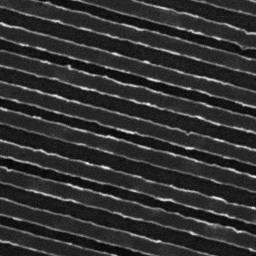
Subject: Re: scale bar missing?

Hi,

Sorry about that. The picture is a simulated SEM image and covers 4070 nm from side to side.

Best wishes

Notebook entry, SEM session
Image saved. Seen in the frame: parallel lines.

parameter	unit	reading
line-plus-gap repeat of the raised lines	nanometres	448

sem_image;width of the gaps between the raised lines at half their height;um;0.194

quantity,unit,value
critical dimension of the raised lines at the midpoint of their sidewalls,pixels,15.7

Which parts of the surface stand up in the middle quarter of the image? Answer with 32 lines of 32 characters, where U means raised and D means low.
UDDDDDDDDUUUUUUUUUUUUUUUDDDDDDDD
UUUDDDDDDDDDDUUUUUUUUUUUUUUUDDDD
UUUUUUDDDDDDDDDDDDUUUUUUUUUUUUUD
UUUUUUUUUUUDDDDDDDDDDUUUUUUUUUUU
UUUUUUUUUUUUUUDDDDDDDDDDUUUUUUUU
DDDUUUUUUUUUUUUUUUDDDDDDDDDDUUUU
DDDDDDUUUUUUUUUUUUUUUUDDDDDDDDDD
DDDDDDDDDDUUUUUUUUUUUUUUUDDDDDDD
DDDDDDDDDDDDDDUUUUUUUUUUUUUUUDDD
UUUDDDDDDDDDDDDDDDUUUUUUUUUUUUUU
UUUUUUUDDDDDDDDDDDDDDUUUUUUUUUUU
UUUUUUUUUUUDDDDDDDDDDDDDDDUUUUUU
UUUUUUUUUUUUUUDDDDDDDDDDDDDDDDUU
DDDDUUUUUUUUUUUUUUDDDDDDDDDDDDDD
DDDDDDDDUUUUUUUUUUUUUUDDDDDDDDDD
UDDDDDDDDDDUUUUUUUUUUUUUUDDDDDDD
UUUUUDDDDDDDDUUUUUUUUUUUUUUUUDDD
UUUUUUUUDDDDDDDDDDUUUUUUUUUUUUUU
UUUUUUUUUUUUUDDDDDDDDDDUUUUUUUUU
DUUUUUUUUUUUUUUUDDDDDDDDDDUUUUUU
DDDDDDUUUUUUUUUUUUUDDDDDDDDDDUUU
DDDDDDDDDUUUUUUUUUUUUUUDDDDDDDDD
DDDDDDDDDDDDUUUUUUUUUUUUUUUDDDDD
UDDDDDDDDDDDDDDDUUUUUUUUUUUUUUUD
UUUUUDDDDDDDDDDDDDDDUUUUUUUUUUUU
UUUUUUUUUDDDDDDDDDDDDDDUUUUUUUUU
UUUUUUUUUUUUDDDDDDDDDDDDDDDUUUUU
UUUUUUUUUUUUUUUUDDDDDDDDDDDDDDDU
DDDDUUUUUUUUUUUUUUUUDDDDDDDDDDDD
DDDDDDDDUUUUUUUUUUUUUUDDDDDDDDDD
UUDDDDDDDDDDDUUUUUUUUUUUUUUDDDDD
UUUUUUDDDDDDDDDDUUUUUUUUUUUUUUDD